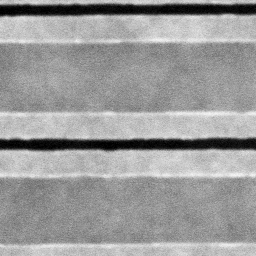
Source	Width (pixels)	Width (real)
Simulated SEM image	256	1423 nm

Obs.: lines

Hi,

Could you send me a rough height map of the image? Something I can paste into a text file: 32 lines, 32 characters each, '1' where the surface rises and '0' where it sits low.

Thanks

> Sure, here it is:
00000000000000000000000000000000
00000000000000000000000000000000
11111111111111111111111111111111
11111111111111111111111111111111
11111111111111111111111111111111
00000000000000000000000000000000
00000000000000000000000000000000
00000000000000000000000000000000
00000000000000000000000000000000
00000000000000000000000000000000
00000000000000000000000000000000
00000000000000000000000000000000
00000000000000000000000000000000
00000000000000000000000000000000
11111111111111111111111111111111
11111111111111111111111111111111
11111111111111111111111111111111
00000000000000000000000000000000
00000000000000000000000000000000
11111111111111111111111111111111
11111111111111111111111111111111
11111111111111111111111111111111
00000000000000000000000000000000
00000000000000000000000000000000
00000000000000000000000000000000
00000000000000000000000000000000
00000000000000000000000000000000
00000000000000000000000000000000
00000000000000000000000000000000
00000000000000000000000000000000
00000000000000000000000000000000
11111111111111111111111111111111